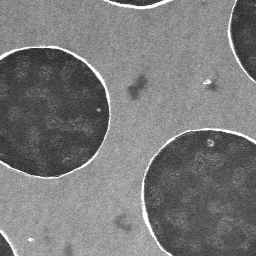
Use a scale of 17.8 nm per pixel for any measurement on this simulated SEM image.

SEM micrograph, holes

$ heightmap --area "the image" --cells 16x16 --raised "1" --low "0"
1111111111111110
1111111111111100
1111111111111100
0000011111111110
0000001111111110
0000000111111111
0000000111111111
0000000111111111
0000000111100001
0000001111000000
1000011110000000
1111111110000000
1111111110000000
1111111110000000
1111111110000000
0111111111000000